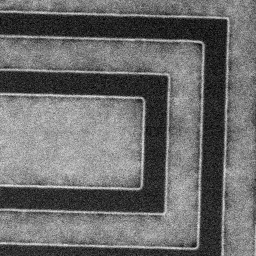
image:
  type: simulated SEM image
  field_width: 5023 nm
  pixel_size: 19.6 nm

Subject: groups of lines, slits or small figures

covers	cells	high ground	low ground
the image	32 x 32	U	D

DDDDDDDDDDDDDDDDDDDDDDDDDDDDDDDD
UUUDDDDDDDDDDDDDDDDDDDDDDDDDDDDD
UUUUUUUUUUUUUUUUUUUUUUUUUUUUDDDD
UUUUUUUUUUUUUUUUUUUUUUUUUUUUUDDD
DDUUUUUUUUUUUUUUUUUUUUUUUUUUUDDD
DDDDDDDDDDDDDDDDDDDDDDDDDUUUDDDD
DDDDDDDDDDDDDDDDDDDDDDDDDUUUDDDD
DDDDDDDDDDDDDDDDDDDDDDDDDUUUDDDD
DDDDDDDDDDDDDDDDDDDDDDDDDUUUDDDD
UUUUUUUUUUUUUUUUUUUUUDDDDUUUDDDD
UUUUUUUUUUUUUUUUUUUUUDDDDUUUDDDD
UUUUUUUUUUUUUUUUUUUUUDDDDUUUDDDD
DDDDDDDDDDDDDDDDDDUUUDDDDUUUDDDD
DDDDDDDDDDDDDDDDDDUUUDDDDUUUDDDD
DDDDDDDDDDDDDDDDDDUUUDDDDUUUDDDD
DDDDDDDDDDDDDDDDDDUUUDDDDUUUDDDD
DDDDDDDDDDDDDDDDDDUUUDDDDUUUDDDD
DDDDDDDDDDDDDDDDDDUUUDDDDUUUDDDD
DDDDDDDDDDDDDDDDDDUUUDDDDUUUDDDD
DDDDDDDDDDDDDDDDDDUUUDDDDUUUDDDD
DDDDDDDDDDDDDDDDDDUUUDDDDUUUDDDD
DDDDDDDDDDDDDDDDDDUUUDDDDUUUDDDD
DDDDDDDDDDDDDDDDDDUUUDDDDUUUDDDD
UUUUUUUUUUDDDDDDDUUUUDDDDUUUDDDD
UUUUUUUUUUUUUUUUUUUUUDDDDUUUDDDD
UUUUUUUUUUUUUUUUUUUUUDDDDUUUDDDD
DDDDDDDDDDUUUUUUUUUUUDDDDUUUDDDD
DDDDDDDDDDDDDDDDDDDDDDDDDUUUDDDD
DDDDDDDDDDDDDDDDDDDDDDDDDUUUDDDD
DDDDDDDDDDDDDDDDDDDDDDDDDUUUDDDD
UUUUUUDDDDDDDDDDDDDDDDDDDUUUDDDD
UUUUUUUUUUUUUUUUUUUUUUUUUUUUDDDD